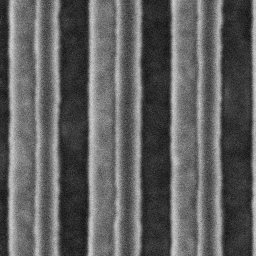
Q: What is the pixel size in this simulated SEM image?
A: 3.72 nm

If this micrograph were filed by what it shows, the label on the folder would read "lines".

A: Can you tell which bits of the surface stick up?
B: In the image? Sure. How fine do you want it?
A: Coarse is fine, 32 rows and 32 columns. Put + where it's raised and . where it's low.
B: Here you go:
.++++++....++++++.....++++++....
.++++++....+++++++....++++++....
.++++++....+++++++....++++++....
.++++++....++++++.....+++++.....
.++++++....+++++++....+++++.....
.++++++....+++++++....+++++.....
.++++++....++++++.....+++++.....
.++++++....++++++....++++++.....
.++++++....++++++.....+++++.....
.++++++....++++++....++++++.....
.++++++....+++++++...++++++.....
.++++++....+++++++...++++++.....
.++++++....++++++....+++++++....
.++++++....++++++....++++++.....
.++++++....++++++.....+++++.....
.++++++....+++++++...++++++.....
.++++++....++++++....++++++.....
.++++++....++++++....++++++.....
.++++++....++++++....++++++.....
.++++++....++++++....++++++.....
.++++++....++++++....++++++.....
.++++++....++++++.....+++++.....
.++++++....++++++....+++++++....
.++++++....++++++....++++++.....
.++++++....++++++....++++++.....
.++++++....++++++....++++++.....
.++++++....++++++....++++++.....
.++++++....++++++....+++++++....
.++++++....++++++....+++++++....
.++++++....++++++....++++++.....
.++++++....++++++.....++++++....
.++++++....++++++....+++++++....